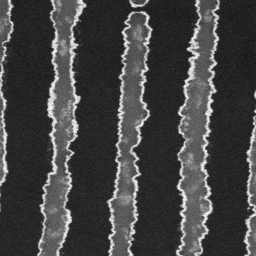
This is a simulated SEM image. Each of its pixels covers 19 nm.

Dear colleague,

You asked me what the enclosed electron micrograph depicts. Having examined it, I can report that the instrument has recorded one or a few lines or trenches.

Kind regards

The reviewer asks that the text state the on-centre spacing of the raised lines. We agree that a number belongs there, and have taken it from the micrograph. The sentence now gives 1300 nm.